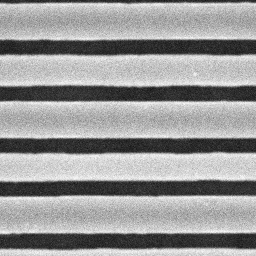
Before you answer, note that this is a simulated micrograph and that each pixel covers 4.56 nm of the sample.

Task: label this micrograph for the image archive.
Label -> lines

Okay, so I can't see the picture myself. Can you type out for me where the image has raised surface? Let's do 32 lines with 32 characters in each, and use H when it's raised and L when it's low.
LLLLLHHHHHHHHHHHLHHHHHHHHHHHHHHH
HHHHHHHHHHHHHHHHHHHHHHHHHHHHHHHH
HHHHHHHHHHHHHHHHHHHHHHHHHHHHHHHH
HHHHHHHHHHHHHHHHHHHHHHHHHHHHHHHH
HHHHHHHHHHHHHHHHHHHHHHHHHHHHHHHH
LLLLLLLLLLLLLLLLLLLLLLLLLLLLLLLL
LLLLLLLLLLLLLLLLLLLLLLLLLLLLLLLL
HHHHHHHHHHHHHHHHHHHHHHHHHHHHHHHH
HHHHHHHHHHHHHHHHHHHHHHHHHHHHHHHH
HHHHHHHHHHHHHHHHHHHHHHHHHHHHHHHH
HHHHHHHHHHHHHHHHHHHHHHHHHHHHHHHH
LLLLLLLLLLLLLLLLLLLLLLLLLLLLLLLL
LLLLLLLLLLLLLLLLLLLLLLLLLLLLLLLL
HHHHHHHHHHHHHHHHHHHHHHHHHHHHHHHH
HHHHHHHHHHHHHHHHHHHHHHHHHHHHHHHH
HHHHHHHHHHHHHHHHHHHHHHHHHHHHHHHH
HHHHHHHHHHHHHHHHHHHHHHHHHHHHHHHH
LLLLLLLLLLLLLLLLLLLLLLLLLLLLLLLL
LLLLLLLLLLLLLLLLLLLLLLLLLLLLLLLL
HHHHHHHHHHHHHHHHHHHHHHHHHHHHHHHH
HHHHHHHHHHHHHHHHHHHHHHHHHHHHHHHH
HHHHHHHHHHHHHHHHHHHHHHHHHHHHHHHH
HHHHHHHHHHHLHHHHHHHHHHHHHLLHHHHL
LLLLLLLLLLLLLLLLLLLLLLLLLLLLLLLL
LLLLLLLLLLLLLLLLLLLLLLLLLLLLLLLL
HHHHHHHHHHHHHHHHHHHHHHHHHHHHHHHH
HHHHHHHHHHHHHHHHHHHHHHHHHHHHHHHH
HHHHHHHHHHHHHHHHHHHHHHHHHHHHHHHH
HHHHHHHHHHHHHHHHHHHHHHHHHHHHHHHH
LLLLLLLLLLLLLLLLLLLLLLLLLLLLLLLL
LLLLLLLLLLLLLLLLLLLLLLLLLLLLLLLL
HHHHHHHHHHHHHHHHHHHHHHHHHHHHHHHH